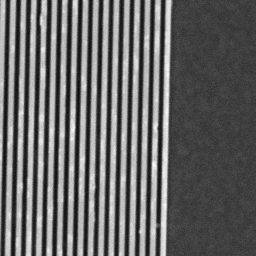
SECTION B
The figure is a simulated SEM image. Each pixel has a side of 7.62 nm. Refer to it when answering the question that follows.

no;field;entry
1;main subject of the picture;parallel lines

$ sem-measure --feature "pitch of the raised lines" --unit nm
78.7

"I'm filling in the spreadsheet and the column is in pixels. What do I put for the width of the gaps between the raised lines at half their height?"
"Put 5.5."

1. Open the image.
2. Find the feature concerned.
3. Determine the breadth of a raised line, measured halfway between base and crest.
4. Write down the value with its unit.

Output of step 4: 36.2 nanometres